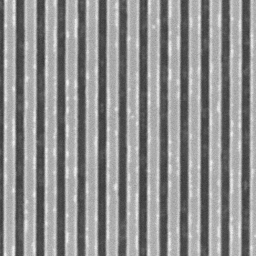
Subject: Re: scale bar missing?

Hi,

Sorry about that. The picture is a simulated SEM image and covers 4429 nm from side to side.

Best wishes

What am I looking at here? parallel lines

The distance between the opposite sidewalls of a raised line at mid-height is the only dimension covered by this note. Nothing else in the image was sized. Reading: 190 nm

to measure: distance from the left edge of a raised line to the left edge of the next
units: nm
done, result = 355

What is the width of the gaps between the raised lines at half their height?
0.171 µm